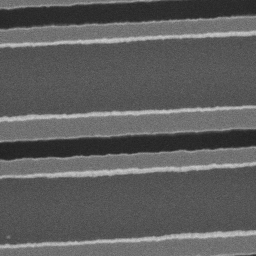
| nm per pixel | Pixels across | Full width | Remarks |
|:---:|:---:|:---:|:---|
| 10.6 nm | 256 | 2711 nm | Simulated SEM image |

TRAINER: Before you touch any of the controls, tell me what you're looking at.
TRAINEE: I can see lines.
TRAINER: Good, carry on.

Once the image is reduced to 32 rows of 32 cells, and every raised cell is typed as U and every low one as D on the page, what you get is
UUUUUUUUUUUDDDDDDDDDDDDDDDDDDDDD
DDDDDDDDDDDDDDDDDDDDDDDDDDDDDDDD
DDDDDDDDDDDDDDDDDDDDDDDUUUUUUUUU
DDDDUUUUUUUUUUUUUUUUUUUUUUUUUUUU
UUUUUUUUUUUUUUUUUUUUUUUUDDDDDDDD
UUUUUDDDDDDDDDDDDDDDDDDDDDDDDDDD
DDDDDDDDDDDDDDDDDDDDDDDDDDDDDDDD
DDDDDDDDDDDDDDDDDDDDDDDDDDDDDDDD
DDDDDDDDDDDDDDDDDDDDDDDDDDDDDDDD
DDDDDDDDDDDDDDDDDDDDDDDDDDDDDDDD
DDDDDDDDDDDDDDDDDDDDDDDDDDDDDDDD
DDDDDDDDDDDDDDDDDDDDDDDDDDDDDDDD
DDDDDDDDDDDDDDDDDDDDDDDDDDDDDDDD
DDDDDDDDDDDDDDDDDDDDDDDDDDDUUUUU
DDDDDDDUUUUUUUUUUUUUUUUUUUUUUUUU
UUUUUUUUUUUUUUUUUUUUUUUUUUUUUUUU
UUUUUUUUUUUUUUUUUUUUUUDDDDDDDDDD
UUUDDDDDDDDDDDDDDDDDDDDDDDDDDDDD
DDDDDDDDDDDDDDDDDDDDDDDDDDDDDDDU
DDDDDDDDDDDDDUUUUUUUUUUUUUUUUUUU
UUUUUUUUUUUUUUUUUUUUUUUUUUUUUUUU
UUUUUUUUUUUUUUUUDDDDDDDDDDDDDDDD
DDDDDDDDDDDDDDDDDDDDDDDDDDDDDDDD
DDDDDDDDDDDDDDDDDDDDDDDDDDDDDDDD
DDDDDDDDDDDDDDDDDDDDDDDDDDDDDDDD
DDDDDDDDDDDDDDDDDDDDDDDDDDDDDDDD
DDDDDDDDDDDDDDDDDDDDDDDDDDDDDDDD
DDDDDDDDDDDDDDDDDDDDDDDDDDDDDDDD
DDDDDDDDDDDDDDDDDDDDDDDDDDDDDDDD
DDDDDDDDDDDDDDDDDDDDDDDUUUUUUUUU
DDDDDDDDUUUUUUUUUUUUUUUUUUUUUUUU
UUUUUUUUUUUUUUUUUUUUUUUUUUUUUUUU